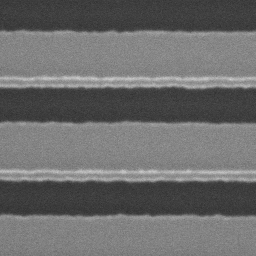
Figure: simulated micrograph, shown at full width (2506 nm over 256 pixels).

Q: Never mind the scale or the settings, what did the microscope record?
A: lines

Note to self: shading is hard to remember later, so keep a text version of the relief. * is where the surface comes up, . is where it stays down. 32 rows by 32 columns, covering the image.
................................
................................
................................
................................
********************************
********************************
********************************
********************************
********************************
********************************
********************************
................................
................................
................................
................................
*********.***********.****......
********************************
********************************
********************************
********************************
********************************
********************************
.......*.**..*.*****..*..*..*.**
................................
................................
................................
................................
********************************
********************************
********************************
********************************
********************************